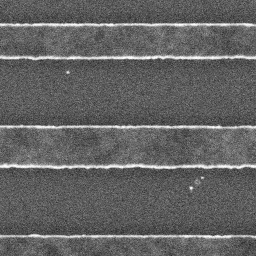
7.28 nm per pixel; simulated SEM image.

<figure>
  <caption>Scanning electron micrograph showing lines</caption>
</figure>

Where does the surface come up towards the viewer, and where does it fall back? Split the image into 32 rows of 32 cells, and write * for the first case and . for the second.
................................
................................
................................
********************************
********************************
********************************
********************************
................................
................................
................................
................................
................................
................................
................................
................................
................................
********************************
********************************
********************************
********************************
********************************
................................
................................
................................
................................
................................
................................
................................
................................
...**.....*.....................
********************************
********************************